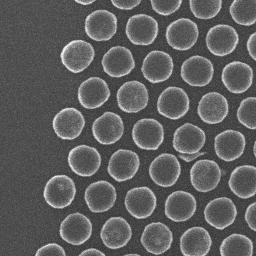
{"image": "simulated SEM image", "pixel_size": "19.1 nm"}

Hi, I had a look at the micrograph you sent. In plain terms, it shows a regular array of raised bodies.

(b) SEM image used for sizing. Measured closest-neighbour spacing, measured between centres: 749 nanometres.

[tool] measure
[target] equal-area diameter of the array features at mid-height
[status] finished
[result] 590 nanometers